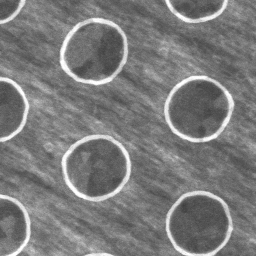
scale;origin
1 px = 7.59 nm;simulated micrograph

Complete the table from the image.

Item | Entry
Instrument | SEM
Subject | raised bodies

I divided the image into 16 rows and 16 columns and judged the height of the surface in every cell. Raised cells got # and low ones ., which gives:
#..........###..
.....##.........
....####........
....####........
....###.........
#..........###..
##........####..
##.........###..
#..........##...
....####........
....####........
....####........
#..........###..
##.........###..
##.........###..
#..........###..